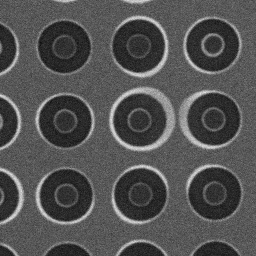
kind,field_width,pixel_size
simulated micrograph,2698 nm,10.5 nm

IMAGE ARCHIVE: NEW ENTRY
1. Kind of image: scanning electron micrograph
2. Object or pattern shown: an array of small figures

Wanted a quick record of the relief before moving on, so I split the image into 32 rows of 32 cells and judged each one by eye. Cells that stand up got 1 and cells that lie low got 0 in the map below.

11111111111111111111111111111111
11111111111111111111111111111111
11111111111111110001111110001111
01111100001111100000111100000111
00111000000111000100011000100011
00111001100111001110011001110011
00111001100111001110011000100011
00111000000111000000111100000111
01111100001111100000111110001111
11111111111111111111111111111111
11111111111111111111111111111111
11111111111111111001111111011111
01111100001111100000111100000111
00111000000111000000011000000011
00111001100011001110011001110011
00111001110011001110011001110011
00111000100111000000011000000011
00111100000111100000111100000111
11111111011111111001111111111111
11111111111111111111111111111111
11111111111111111111111111111111
01111110001111110000111110000111
00111000000111100000111100000011
00111001100011000110011100110011
00011001110011001110011100110011
00011000100011000100011100100011
00111000000111100000111100000111
01111110001111110001111111011111
11111111111111111111111111111111
11111111111111111111111111111111
11111110011111110001111110001111
00111100000111100000111100000011